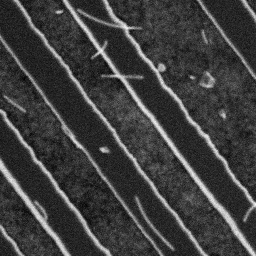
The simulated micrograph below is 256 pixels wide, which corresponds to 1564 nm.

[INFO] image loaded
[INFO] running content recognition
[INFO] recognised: lines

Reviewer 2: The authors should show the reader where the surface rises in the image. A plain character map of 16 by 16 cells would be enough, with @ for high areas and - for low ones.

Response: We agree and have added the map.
@---@@@------@@@
@@---@@@-----@@@
@@@---@@------@@
-@@@--@@@------@
--@@---@@@------
--@@@---@@@-----
---@@@---@@-----
@---@@@---@@----
@---@@@---@@@---
@@---@@@---@@@--
@@@---@@@---@@--
-@@@---@@@--@@@-
--@@---@@@---@@@
--@@@---@@@---@@
---@@@---@@@---@
@---@@----@@@--@